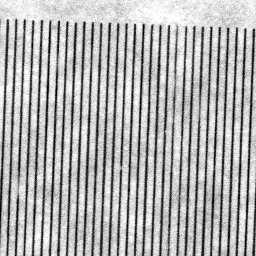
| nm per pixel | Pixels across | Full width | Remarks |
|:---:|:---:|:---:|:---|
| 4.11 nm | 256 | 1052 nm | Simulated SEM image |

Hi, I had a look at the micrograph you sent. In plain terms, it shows parallel lines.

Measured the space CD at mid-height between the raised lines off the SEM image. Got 7.7 nm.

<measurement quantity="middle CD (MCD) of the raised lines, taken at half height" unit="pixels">6.62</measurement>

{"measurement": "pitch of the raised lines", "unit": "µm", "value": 0.0349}